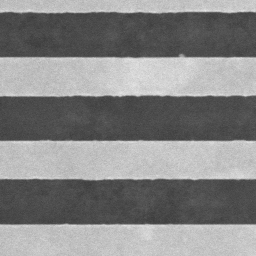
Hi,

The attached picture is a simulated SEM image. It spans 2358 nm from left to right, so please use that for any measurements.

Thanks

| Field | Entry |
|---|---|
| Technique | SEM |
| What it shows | lines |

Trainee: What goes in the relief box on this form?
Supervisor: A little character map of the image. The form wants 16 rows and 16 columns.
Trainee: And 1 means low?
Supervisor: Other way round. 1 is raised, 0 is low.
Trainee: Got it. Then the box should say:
1111111111111111
0000000000000000
0000000000000000
0000000000000000
1111111111111111
1111111111111111
0000000000000000
0000000000000000
0000000000000000
1111111111111111
1111111111111111
0000000000000000
0000000000000000
0000000000000000
1111111111111111
1111111111111111